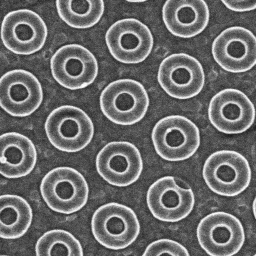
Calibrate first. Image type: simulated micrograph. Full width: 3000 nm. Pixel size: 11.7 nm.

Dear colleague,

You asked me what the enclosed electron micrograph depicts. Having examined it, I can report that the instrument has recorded a regular array of ring-shaped raised bodies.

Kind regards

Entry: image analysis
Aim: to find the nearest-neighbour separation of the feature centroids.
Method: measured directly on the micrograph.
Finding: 718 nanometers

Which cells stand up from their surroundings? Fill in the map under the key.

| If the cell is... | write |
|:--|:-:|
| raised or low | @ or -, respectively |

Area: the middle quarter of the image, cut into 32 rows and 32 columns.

-----@@@----------------@@@@@@@@
-----@@@----------------@@@@---@
@---@@@@----------------@@@-----
@@@@@@@@----------------@@@-----
@@@@@@@------@@@@@------@@@----@
@@@@@------@@@@@@@@-----@@@@@@@@
----------@@@@@@@@@@-----@@@@@@@
----------@@@@--@@@@@-----@@@@@@
---------@@@@----@@@@--------@@-
---------@@@@-----@@@-----------
@--------@@@@----@@@@-----------
@@@@------@@@@--@@@@------------
@@@@@-----@@@@@@@@@@------------
@@@@@@-----@@@@@@@@------@@@@@--
---@@@@------@@@@@------@@@@@@@@
----@@@----------------@@@@@@@@@
----@@@---------------@@@@@--@@@
---@@@@---------------@@@@----@@
@-@@@@@---------------@@@-----@@
@@@@@@----------------@@@-----@@
@@@@@-----@@@@@@@------@@@---@@@
@@@@-----@@@@@@@@@-----@@@@@@@@@
---------@@@@@@@@@@-----@@@@@@@@
--------@@@@---@@@@------@@@@@@-
--------@@@-----@@@-------------
--------@@@-----@@@-------------
@@------@@@@---@@@@-------------
@@@@-----@@@@@@@@@@-------------
@@@@@-----@@@@@@@@-------@@-----
-@@@@------@@@@@@------@@@@@----
--@@@@----------------@@@@@@----
--@@@@---------------@@@@@-@@@@-